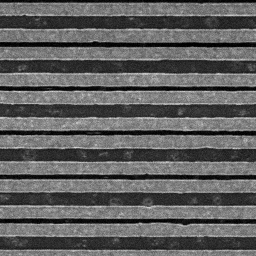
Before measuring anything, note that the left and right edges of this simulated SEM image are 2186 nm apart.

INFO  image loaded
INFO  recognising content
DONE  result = parallel lines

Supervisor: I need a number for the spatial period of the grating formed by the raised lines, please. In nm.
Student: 188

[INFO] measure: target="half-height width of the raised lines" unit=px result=12.8